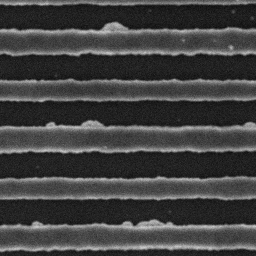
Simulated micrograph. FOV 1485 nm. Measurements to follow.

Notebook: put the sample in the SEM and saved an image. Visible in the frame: lines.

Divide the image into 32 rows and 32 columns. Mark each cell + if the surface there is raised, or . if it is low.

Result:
++++++++....+++++.....+....++...
................................
................................
............................+...
++++++++++++++++++++++++++++++++
++++++++++++++++++++++++++++++++
++++++++++++++++++++++++++++++++
................................
................................
................................
++++++++++++++++++++++++++++++++
++++++++++++++++++++++++++++++++
++++++++++++++++++..++++++++.++.
................................
................................
................................
++++++++++++++++++++++++++++++++
++++++++++++++++++++++++++++++++
++++++++++++++++++++++++++++++++
................................
................................
................................
++++++++++++++++++++++++++++++++
++++++++++++++++++++++++++++++++
++++++++++++++++++++++++++++++++
................................
................................
................................
++++++++++++++++++++++++++++++++
++++++++++++++++++++++++++++++++
++++++++++++++++++++++++++++++++
................................